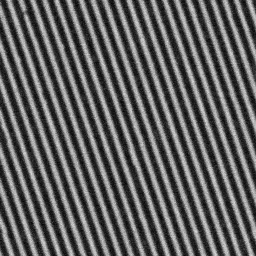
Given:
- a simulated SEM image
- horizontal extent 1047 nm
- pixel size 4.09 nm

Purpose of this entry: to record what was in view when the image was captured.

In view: parallel lines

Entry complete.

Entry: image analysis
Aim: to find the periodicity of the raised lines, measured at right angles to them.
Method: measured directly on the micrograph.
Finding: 46.4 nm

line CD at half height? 18.4 nanometres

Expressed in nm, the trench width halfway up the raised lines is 29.